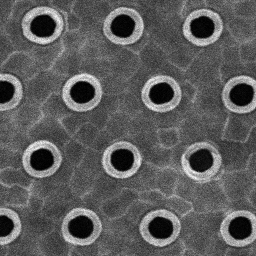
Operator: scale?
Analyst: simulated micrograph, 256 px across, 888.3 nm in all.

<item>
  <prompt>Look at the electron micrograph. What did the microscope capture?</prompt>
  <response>a regular array of ring-shaped raised bodies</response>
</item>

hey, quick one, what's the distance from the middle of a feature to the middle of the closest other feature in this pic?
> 269 nm